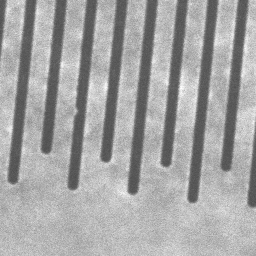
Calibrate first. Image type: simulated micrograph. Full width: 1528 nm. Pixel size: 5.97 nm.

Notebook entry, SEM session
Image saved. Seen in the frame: parallel lines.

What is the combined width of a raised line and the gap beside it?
180 nm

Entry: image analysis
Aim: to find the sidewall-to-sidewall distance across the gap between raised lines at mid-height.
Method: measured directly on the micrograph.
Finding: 57.9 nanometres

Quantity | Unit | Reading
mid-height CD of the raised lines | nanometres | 121